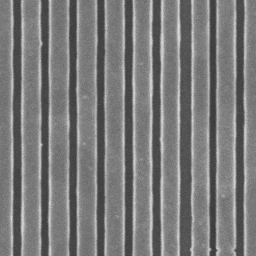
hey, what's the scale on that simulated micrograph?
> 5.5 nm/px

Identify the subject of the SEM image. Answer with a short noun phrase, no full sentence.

parallel lines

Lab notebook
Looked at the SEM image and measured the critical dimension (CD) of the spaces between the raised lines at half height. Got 51.6 nm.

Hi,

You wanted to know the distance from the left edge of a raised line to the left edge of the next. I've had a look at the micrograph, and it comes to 153 nanometres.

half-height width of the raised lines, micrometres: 0.104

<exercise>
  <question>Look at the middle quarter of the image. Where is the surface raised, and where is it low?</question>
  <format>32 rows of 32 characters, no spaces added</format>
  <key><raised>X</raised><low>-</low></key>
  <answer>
X--XXXXX--XXXXX--XXXXX---XXXX---
X--XXXXX--XXXXX--XXXXX---XXXX---
X--XXXXX--XXXXX--XXXXX---XXXX---
X--XXXXX--XXXXX--XXXXX---XXXX---
X--XXXXX--XXXXX--XXXXX--XXXXX---
X--XXXXX--XXXXX--XXXXX--XXXXX---
X--XXXXX--XXXXX--XXXXX--XXXXX---
X--XXXXX--XXXXX--XXXXX--XXXXX---
X--XXXXX--XXXXX--XXXXX--XXXXX---
X--XXXXX--XXXXX--XXXXX---XXXX---
X---XXXX--XXXXX--XXXXX---XXXX---
X---XXXX--XXXXX--XXXXX---XXXX---
X---XXXX--XXXXX--XXXXX---XXXX---
X---XXXX--XXXXX--XXXXX---XXXX---
X---XXXX--XXXXX--XXXXX---XXXX---
X---XXXX--XXXXX--XXXXX---XXXX---
X---XXXX--XXXXX--XXXXX---XXXX---
X---XXXX--XXXXX--XXXXX--XXXXX---
X---XXXX--XXXXX--XXXXX--XXXXX---
X---XXXX--XXXXX--XXXXX--XXXXX---
X---XXXX---XXXX--XXXXX---XXXX---
X---XXXX--XXXXX--XXXXX---XXXX---
X---XXXX--XXXXX--XXXXX---XXXX---
X---XXXX--XXXXX---XXXX---XXXX---
X---XXXX--XXXXX--XXXXX---XXXX---
X---XXXX--XXXXX--XXXXX---XXXX---
X---XXXX--XXXXX--XXXXX---XXXX---
X---XXXX--XXXXX--XXXXX---XXXX---
X---XXXX--XXXXX---XXXX---XXXX---
X---XXXX--XXXXX---XXXX--XXXXX---
X---XXXX--XXXXX---XXXX--XXXXX---
X---XXXX--XXXXX---XXXX--XXXXX---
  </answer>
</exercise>